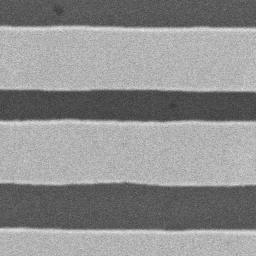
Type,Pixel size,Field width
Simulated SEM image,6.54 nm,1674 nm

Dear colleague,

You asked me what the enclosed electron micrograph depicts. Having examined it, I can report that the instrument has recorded lines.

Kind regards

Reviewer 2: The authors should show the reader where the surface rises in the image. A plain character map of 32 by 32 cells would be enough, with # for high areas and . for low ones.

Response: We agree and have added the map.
................................
................................
................................
##############..................
################################
################################
################################
################################
################################
################################
################################
................................
................................
................................
................................
################################
################################
################################
################################
################################
################################
################################
################################
................................
................................
................................
................................
................................
................................
################################
################################
################################